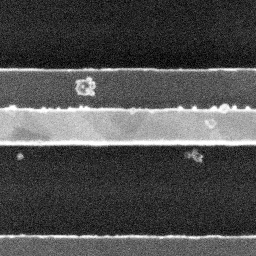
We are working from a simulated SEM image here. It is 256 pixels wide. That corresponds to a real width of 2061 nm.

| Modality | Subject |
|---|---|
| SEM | lines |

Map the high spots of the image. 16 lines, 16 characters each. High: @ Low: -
----------------
----------------
----------------
----------------
@@@@@@@@@@@@@@@@
@@@@@@@@@@@@@@@@
@@@@@@@@@@@@@@@@
@@@@@@@@@@@@@@@@
@@@@@@@@@@@@@@@@
----------------
----------------
----------------
----------------
----------------
----------------
@@@@@@@@@@@@@@@@